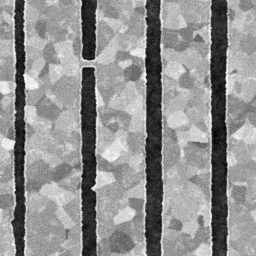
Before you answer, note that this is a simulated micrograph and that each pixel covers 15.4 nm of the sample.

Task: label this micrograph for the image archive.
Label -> one or a few lines or trenches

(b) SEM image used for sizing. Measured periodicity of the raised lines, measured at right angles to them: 1020 nanometers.